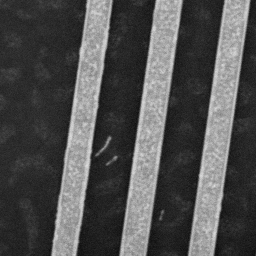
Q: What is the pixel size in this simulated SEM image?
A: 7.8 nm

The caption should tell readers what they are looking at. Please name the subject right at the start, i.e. one or a few lines or trenches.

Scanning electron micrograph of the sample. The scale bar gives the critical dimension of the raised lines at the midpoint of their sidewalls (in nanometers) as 178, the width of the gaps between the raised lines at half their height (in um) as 0.349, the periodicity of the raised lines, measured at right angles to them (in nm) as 530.